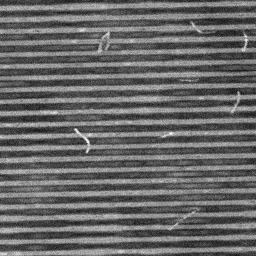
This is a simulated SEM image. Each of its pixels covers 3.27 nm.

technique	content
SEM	parallel lines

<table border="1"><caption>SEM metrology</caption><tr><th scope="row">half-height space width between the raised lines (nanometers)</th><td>24.1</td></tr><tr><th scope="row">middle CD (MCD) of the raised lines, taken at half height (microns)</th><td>0.0143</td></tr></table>